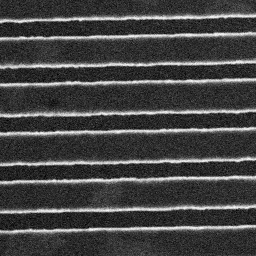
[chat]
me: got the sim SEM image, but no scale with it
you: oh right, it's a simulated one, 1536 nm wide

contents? lines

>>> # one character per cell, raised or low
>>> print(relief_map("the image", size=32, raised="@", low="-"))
@@@@@@@@@@@@@@@@@@@@@@@@@@@@@@@@
@@@@@@@@@@@@@@@@@@@@@@@@@@@@@@@@
@@@@@@@@@-----------------------
--------------------------------
-----------------@@@@@@@@@@@@@@@
@@@@@@@@@@@@@@@@@@@@@@@@@@@@@@@@
@@@@@@@@@@@@@@@@@@@@@@@@@@@@@@@@
@@@@@@@@@@@@@@@@@@@@@@@@@@@@@@@@
--------------------------------
--------------------------------
-@@@@@@@@@@@@@@@@@@@@@@@@@@@@@@@
@@@@@@@@@@@@@@@@@@@@@@@@@@@@@@@@
@@@@@@@@@@@@@@@@@@@@@@@@@@@@@@@@
@@@@@@@@@@@@@@@@@@@@@@@@@@@@@@@@
@@------------------------------
--------------------------------
----------@@@@@@@@@@@@@@@@@@@@@@
@@@@@@@@@@@@@@@@@@@@@@@@@@@@@@@@
@@@@@@@@@@@@@@@@@@@@@@@@@@@@@@@@
@@@@@@@@@@@@@@@@@@@@@@@@@@@@@@@@
@@@@@@@-------------------------
--------------------------------
--------------@@@@@@@@@@@@@@@@@@
@@@@@@@@@@@@@@@@@@@@@@@@@@@@@@@@
@@@@@@@@@@@@@@@@@@@@@@@@@@@@@@@@
@@@@@@@@@@@@@@@@@@@@@@@@@@@@@@@@
@-------------------------------
--------------------------------
-----------------@@@@@@@@@@@@@@@
@@@@@@@@@@@@@@@@@@@@@@@@@@@@@@@@
@@@@@@@@@@@@@@@@@@@@@@@@@@@@@@@@
@@@@@@@@@@@@@@@@@@@@@@@@@@@@@@@@